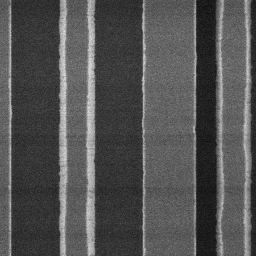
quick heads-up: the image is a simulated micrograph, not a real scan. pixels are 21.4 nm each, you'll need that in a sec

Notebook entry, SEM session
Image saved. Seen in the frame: lines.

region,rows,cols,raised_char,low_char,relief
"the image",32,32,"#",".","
#.......###.......######...####.
#.......###.......######...####.
#.......###.......######...####.
#.......####......######...####.
#.......####......######...####.
#.......####......######...####.
#.......###.......#######..####.
#.......###.......#######..####.
#.......###.......######...####.
#.......###.......######...####.
#.......###.......######...####.
#.......###.......######...####.
#.......###.......######...####.
#.......###.......######...####.
#.......###.......######...####.
#.......###.......######...####.
#.......###.......######...####.
#.......###.......######...####.
#.......###.......######...####.
#.......###.......######...####.
#.......###.......######...####.
#.......###.......######...####.
#.......###.......######....###.
#.......###.......######....###.
#.......###.......######....###.
#.......###.......######...####.
#.......###.......######...####.
#.......###.......######...####.
#.......###.......######...####.
#.......###.......######...####.
#.......###.......######...####.
#.......###.......######...####.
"